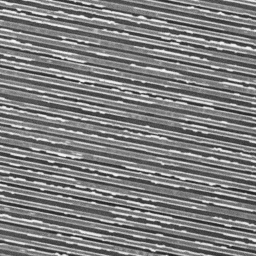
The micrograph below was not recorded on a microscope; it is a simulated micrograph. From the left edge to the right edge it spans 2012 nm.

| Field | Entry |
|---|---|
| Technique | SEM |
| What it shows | parallel lines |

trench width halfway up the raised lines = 28.9 nanometres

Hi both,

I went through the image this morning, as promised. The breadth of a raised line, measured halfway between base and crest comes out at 42.4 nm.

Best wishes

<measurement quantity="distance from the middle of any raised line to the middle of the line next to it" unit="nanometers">75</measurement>